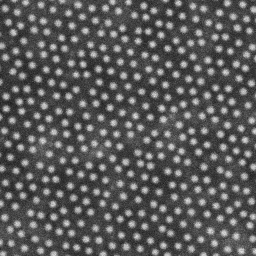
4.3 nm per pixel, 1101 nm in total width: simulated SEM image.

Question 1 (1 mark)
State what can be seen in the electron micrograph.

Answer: a regular array of raised bodies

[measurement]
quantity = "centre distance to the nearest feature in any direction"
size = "50.3 nm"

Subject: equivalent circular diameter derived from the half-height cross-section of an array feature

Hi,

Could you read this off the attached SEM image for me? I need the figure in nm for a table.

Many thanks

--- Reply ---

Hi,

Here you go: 26.6